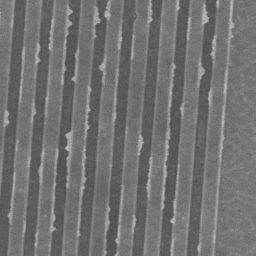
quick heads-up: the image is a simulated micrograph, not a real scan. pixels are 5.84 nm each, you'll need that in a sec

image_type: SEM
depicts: parallel lines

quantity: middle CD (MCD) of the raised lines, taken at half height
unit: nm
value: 92.4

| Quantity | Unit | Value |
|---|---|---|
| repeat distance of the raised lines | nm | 159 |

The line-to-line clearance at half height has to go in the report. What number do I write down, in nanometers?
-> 65.5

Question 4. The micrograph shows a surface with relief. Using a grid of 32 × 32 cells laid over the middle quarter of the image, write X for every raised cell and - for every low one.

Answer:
---XXXX--XXXXX---XXX----XXXX--XX
---XXXX--XXXXX---XXX----XXXX--XX
---XXXX---XXXX---XXX----XXX---XX
--XXXXX---XXX---XXXX---XXXX---XX
---XXXX---XXX---XXXX---XXXX---XX
---XXX----XXX---XXXX---XXXX---XX
---XXXX--XXXX---XXXX---XXXX---XX
---XXX---XXXX---XXXX---XXXX---XX
---XXX---XXXX---XXXX---XXXX---XX
--XXXX---XXXX---XXXX---XXXX---XX
--XXXX---XXXX---XXXX---XXXX--XXX
--XXXXX--XXXX---XXXX---XXX---XXX
--XXXX---XXXX---XXXX---XXX---XXX
--XXXX---XXXX---XXX----XXX---XXX
--XXXX---XXXX---XXX---XXXX---XXX
--XXXX---XXXX---XXX---XXXX---XXX
--XXXX---XXX---XXXX---XXXX---XXX
-XXXXX---XXX---XXXX---XXXX---XXX
-XXXXX---XXX---XXXXX--XXXXX--XXX
-XXXX---XXXX---XXXXX--XXXX---XXX
-XXXX---XXXX---XXXX---XXXX---XXX
-XXXX---XXXX---XXXX---XXXX---XXX
-XXXX---XXXX---XXXX---XXXX---XXX
-XXXX---XXXX---XXXX--XXXXX---XXX
-XXXX---XXXX---XXXX--XXXXX---XXX
-XXXX---XXXX---XXXX---XXXX---XXX
-XXXX---XXXX---XXX---XXXXX--XXXX
-XXXX---XXXX---XXX---XXXXX--XXXX
-XXXX---XXXX---XXX---XXXXX--XXXX
-XXXX---XXX---XXXX---XXXX---XXXX
-XXXX---XXX---XXXX---XXXX---XXXX
-XXXX---XXX---XXXX---XXXX---XXXX